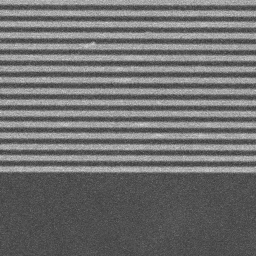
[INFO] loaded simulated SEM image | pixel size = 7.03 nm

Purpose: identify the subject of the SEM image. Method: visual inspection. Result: parallel lines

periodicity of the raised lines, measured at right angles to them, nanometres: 78.2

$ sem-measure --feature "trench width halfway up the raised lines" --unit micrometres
0.0474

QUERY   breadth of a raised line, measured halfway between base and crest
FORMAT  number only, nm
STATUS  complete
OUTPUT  29.9